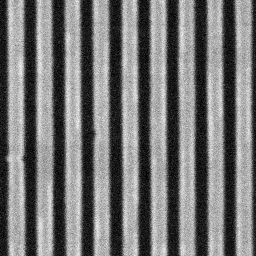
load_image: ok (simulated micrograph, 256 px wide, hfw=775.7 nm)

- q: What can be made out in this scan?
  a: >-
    parallel lines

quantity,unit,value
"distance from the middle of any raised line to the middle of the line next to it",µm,0.0862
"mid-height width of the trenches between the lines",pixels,13.8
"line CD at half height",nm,44.3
